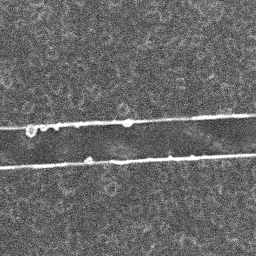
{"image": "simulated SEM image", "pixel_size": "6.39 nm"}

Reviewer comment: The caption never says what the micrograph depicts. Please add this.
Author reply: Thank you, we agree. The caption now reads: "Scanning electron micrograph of one or a few lines or trenches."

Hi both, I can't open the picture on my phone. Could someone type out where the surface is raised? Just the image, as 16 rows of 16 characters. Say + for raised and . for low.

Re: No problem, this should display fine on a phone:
++++++++++++++++
++++++++++++++++
++++++++++++++++
++++++++++++++++
++++++++++++++++
++++++++++++++++
++++++++++++++++
+++++++++++.....
................
................
++++++++++++++++
++++++++++++++++
++++++++++++++++
++++++++++++++++
++++++++++++++++
++++++++++++++++